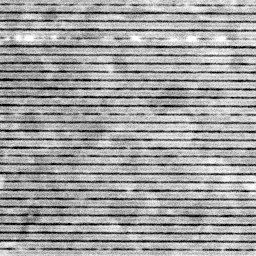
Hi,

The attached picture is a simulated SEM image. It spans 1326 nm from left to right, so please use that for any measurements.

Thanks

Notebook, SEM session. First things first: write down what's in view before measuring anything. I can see parallel lines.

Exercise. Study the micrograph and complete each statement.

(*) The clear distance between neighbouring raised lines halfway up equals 9.1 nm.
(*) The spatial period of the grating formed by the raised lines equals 43.8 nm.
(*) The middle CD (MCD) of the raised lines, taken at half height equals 31.1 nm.